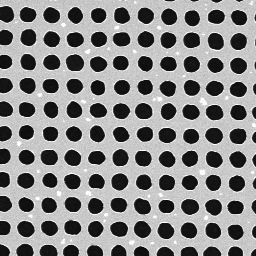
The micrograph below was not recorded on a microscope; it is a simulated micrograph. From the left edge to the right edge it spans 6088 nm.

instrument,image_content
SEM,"a regular array of holes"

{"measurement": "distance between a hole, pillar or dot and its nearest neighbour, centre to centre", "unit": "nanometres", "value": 546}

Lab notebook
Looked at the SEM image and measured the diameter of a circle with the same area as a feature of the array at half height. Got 386 nm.